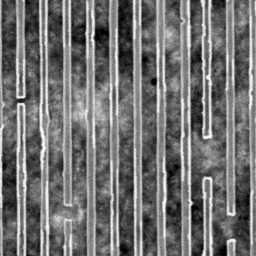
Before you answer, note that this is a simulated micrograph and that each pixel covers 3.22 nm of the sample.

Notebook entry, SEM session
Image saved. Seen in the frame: parallel lines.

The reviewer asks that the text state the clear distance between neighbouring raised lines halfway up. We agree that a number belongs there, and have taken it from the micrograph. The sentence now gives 50.4 nm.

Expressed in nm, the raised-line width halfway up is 25.4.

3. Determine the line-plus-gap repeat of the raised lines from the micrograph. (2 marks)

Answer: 0.075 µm